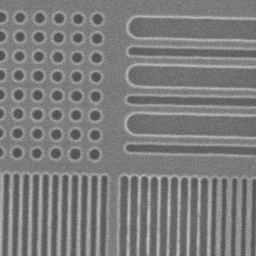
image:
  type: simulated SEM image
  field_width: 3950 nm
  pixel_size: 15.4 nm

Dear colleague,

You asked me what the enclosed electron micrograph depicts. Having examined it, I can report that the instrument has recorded groups of lines, slits or small figures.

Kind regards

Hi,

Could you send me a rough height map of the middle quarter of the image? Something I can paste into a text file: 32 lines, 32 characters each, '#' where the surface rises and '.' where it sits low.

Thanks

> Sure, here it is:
#################...............
################................
##..###..#######................
##..###..#######................
################................
##################..............
################################
##..###..#######################
##..###..#######................
################................
###############################.
################################
##..##...########...............
##..##...#######................
################................
################................
##..###..#######................
#...##...#########..............
##..##...#######################
################################
###############.................
##..###..######.................
#...##...#################......
##..##...#######################
################################
################################
################################
################################
.#....#....###..#.#..#.#..#.##.#
.#....#....###..................
.#....#....###..................
.#....#....###..................